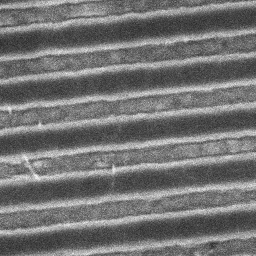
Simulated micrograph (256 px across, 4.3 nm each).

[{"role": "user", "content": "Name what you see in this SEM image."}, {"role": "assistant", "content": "parallel lines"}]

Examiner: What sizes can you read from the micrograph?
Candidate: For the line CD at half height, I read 29.1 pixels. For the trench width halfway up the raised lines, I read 90.8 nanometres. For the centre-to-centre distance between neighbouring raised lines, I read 0.217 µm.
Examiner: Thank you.